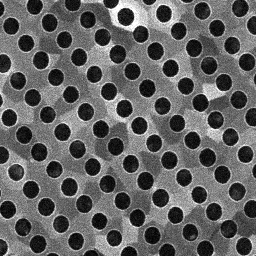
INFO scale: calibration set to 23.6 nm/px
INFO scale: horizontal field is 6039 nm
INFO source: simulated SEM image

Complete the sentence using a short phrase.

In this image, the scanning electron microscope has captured a regular array of holes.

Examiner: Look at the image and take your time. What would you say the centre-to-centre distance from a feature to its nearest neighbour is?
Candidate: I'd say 536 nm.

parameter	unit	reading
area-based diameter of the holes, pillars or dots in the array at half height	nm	416